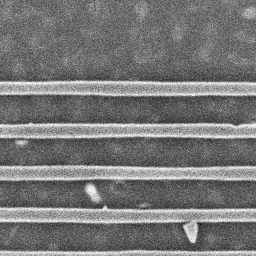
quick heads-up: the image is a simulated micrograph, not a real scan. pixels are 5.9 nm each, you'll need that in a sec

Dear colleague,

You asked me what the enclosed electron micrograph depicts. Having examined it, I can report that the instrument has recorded parallel lines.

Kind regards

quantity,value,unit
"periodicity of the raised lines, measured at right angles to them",250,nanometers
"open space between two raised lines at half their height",179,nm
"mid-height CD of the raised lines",71.5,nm